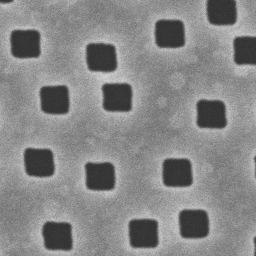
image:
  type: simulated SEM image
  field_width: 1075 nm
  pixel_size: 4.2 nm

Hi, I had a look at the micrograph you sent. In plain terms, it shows a regular array of holes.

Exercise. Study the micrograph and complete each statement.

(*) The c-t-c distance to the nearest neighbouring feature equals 262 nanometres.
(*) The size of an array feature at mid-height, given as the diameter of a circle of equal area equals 135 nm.